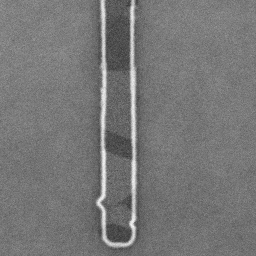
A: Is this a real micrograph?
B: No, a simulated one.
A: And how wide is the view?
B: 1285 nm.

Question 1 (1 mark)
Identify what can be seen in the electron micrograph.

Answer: one or a few lines or trenches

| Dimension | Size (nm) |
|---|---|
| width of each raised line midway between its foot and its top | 151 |